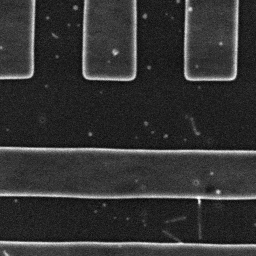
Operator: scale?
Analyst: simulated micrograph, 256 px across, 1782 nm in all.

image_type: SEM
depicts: groups of lines, slits or small figures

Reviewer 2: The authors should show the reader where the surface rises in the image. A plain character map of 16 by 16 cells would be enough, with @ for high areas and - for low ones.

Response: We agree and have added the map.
@@---@@@----@@@-
@@---@@@----@@@-
@@---@@@----@@@-
@@---@@@----@@@-
@@---@@@----@@@-
----------------
----------------
----------------
----------------
@@@@@@@@@@@@@@@@
@@@@@@@@@@@@@@@@
@@@@@@@@@@@@@@@@
----------------
----------------
----------------
@@@@@@@@@@@@@@@@